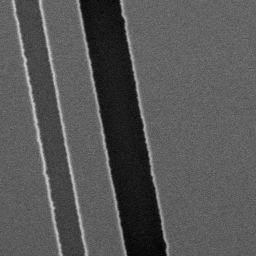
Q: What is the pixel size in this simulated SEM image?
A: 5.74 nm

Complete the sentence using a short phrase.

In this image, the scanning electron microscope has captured lines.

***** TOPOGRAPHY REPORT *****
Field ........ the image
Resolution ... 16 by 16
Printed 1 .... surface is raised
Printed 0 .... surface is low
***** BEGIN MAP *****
1111100011111111
1111100011111111
1111100011111111
1111110011111111
1111110011111111
1111110001111111
1111110001111111
1111110001111111
1111110001111111
1111111001111111
1111111001111111
1111111000111111
1111111000111111
1111111000111111
1111111100111111
1111111100111111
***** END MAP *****